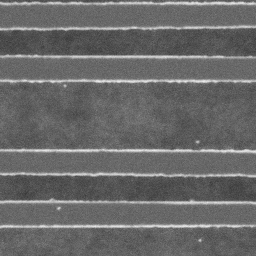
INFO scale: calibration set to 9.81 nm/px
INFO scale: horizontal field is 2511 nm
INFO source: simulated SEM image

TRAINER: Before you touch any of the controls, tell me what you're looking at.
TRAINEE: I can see lines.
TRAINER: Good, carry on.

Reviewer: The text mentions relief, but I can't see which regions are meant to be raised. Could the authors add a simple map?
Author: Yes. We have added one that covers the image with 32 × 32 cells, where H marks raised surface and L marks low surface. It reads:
HHHHHHHHHHHHHHHHHHHHHHHHHHHHHHHH
HHHHHHHHHHHHHHHHHHHHHHHHHHHHHHHH
HHHHHHHHHHHHHHHHHHHHHHHHHHHHHHHH
HHHHHHHHHHHHHHHHHHHHHHHHHHHHHHLL
LLLLLLLLLLLLLLLLLLLLLLLLLLLLLLLL
LLLLLLLLLLLLLLLLLLLLLLLLLLLLLLLL
LLLLLLLLLLLLLLLLLLLLLLLLLLLLLLLL
HHHHHHHHHHHHHHHHHHHHHHHHHHHHHHHH
HHHHHHHHHHHHHHHHHHHHHHHHHHHHHHHH
HHHHHHHHHHHHHHHHHHHHHHHHHHHHHHHH
LLLLLLLLLLLLLLLLLLLLLLLLLLLLLLLL
LLLLLLLLLLLLLLLLLLLLLLLLLLLLLLLL
LLLLLLLLLLLLLLLLLLLLLLLLLLLLLLLL
LLLLLLLLLLLLLLLLLLLLLLLLLLLLLLLL
LLLLLLLLLLLLLLLLLLLLLLLLLLLLLLLL
LLLLLLLLLLLLLLLLLLLLLLLLLLLLLLLL
LLLLLLLLLLLLLLLLLLLLLLLLLLLLLLLL
LLLLLLLLLLLLLLLLLLLLLLLLLLLLLLLL
LLLLLLLLLLLLLLLLLLLLLLLLLLLLLLLL
HHHHHHHHHHHHHHHHHHHHHHHHHHHHHHHH
HHHHHHHHHHHHHHHHHHHHHHHHHHHHHHHH
HHHHHHHHHHHHHHHHHHHHHHHHHHHHHHHH
LLLLLLLLLLLLLLLLLLLLLLLLLLLLLLLL
LLLLLLLLLLLLLLLLLLLLLLLLLLLLLLLL
LLLLLLLLLLLLLLLLLLLLLLLLLLLLLLLL
HHHHHHHHHHHHHHHHHHHHHHHHHHHHHHHH
HHHHHHHHHHHHHHHHHHHHHHHHHHHHHHHH
HHHHHHHHHHHHHHHHHHHHHHHHHHHHHHHH
LLLLLLLLLLLLLLLLLLLLLLLLLLLLLLLL
LLLLLLLLLLLLLLLLLLLLLLLLLLLLLLLL
LLLLLLLLLLLLLLLLLLLLLLLLLLLLLLLL
LLLLLLLLLLLLLLLLLLLLLLLLLLLLLLLL